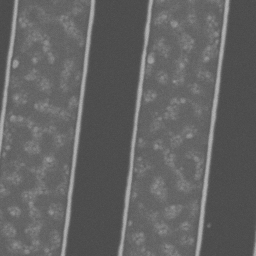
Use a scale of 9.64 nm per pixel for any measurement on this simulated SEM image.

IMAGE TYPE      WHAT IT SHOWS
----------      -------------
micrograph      one or a few lines or trenches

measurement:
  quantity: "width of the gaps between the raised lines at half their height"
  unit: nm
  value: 726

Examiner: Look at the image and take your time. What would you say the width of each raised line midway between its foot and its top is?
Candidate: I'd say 58.8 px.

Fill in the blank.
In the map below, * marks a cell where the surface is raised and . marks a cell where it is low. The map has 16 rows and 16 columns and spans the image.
*.....***.....**
*.....***.....**
*....****.....**
*....****.....**
*....****.....**
.....****.....**
.....****....***
.....****....***
.....***.....***
.....***.....***
.....***.....***
....****.....***
....****.....***
....****.....***
....****....****
....****....****